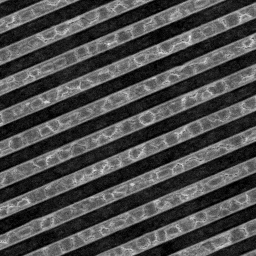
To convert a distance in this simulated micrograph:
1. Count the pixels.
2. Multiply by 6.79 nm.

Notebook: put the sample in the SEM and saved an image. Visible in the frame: parallel lines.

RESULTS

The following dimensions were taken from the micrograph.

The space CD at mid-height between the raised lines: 0.0983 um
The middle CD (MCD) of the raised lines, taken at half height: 98.3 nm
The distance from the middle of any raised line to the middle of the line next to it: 28.4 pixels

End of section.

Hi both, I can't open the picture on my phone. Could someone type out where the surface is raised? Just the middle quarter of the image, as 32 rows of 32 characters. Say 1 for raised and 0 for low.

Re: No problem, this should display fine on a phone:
10000000001111111110000000000111
00000000111111111000000000011111
00000011111111100000000011111111
00011111111100000000001111111110
01111111110000000000111111111000
11111111000000000111111111000000
11111000000000011111111100000000
11100000000011111111110000000011
10000000001111111110000000001111
00000000111111111000000000111111
00000111111111000000000111111111
00011111111100000000011111111100
01111111110000000001111111110000
11111110000000001111111110000000
11111000000000111111111000000000
11100000000011111111100000000011
00000000011111111100000000001111
00000001111111110000000001111111
00001111111111000000000111111110
00111111111000000000011111111000
11111111100000000011111111100000
11111110000000001111111100000000
11110000000000111111110000000001
11000000000111111111000000000111
00000000011111111000000000011111
00000001111111100000000011111111
00001111111110000000001111111110
00111111110000000000111111111000
11111111000000000111111111000000
11111100000000011111111100000000
11100000000001111111110000000001
10000000001111111110000000000111